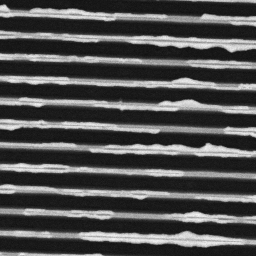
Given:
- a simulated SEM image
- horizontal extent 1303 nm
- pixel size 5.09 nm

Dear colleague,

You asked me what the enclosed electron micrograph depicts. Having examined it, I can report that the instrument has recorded parallel lines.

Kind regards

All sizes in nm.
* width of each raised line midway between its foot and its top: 43.9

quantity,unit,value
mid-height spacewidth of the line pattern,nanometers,70.6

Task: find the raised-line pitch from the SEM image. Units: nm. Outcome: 112